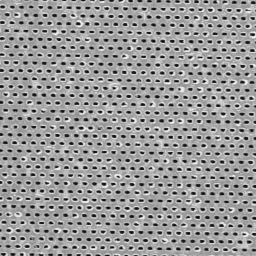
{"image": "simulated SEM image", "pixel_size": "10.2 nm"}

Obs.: a regular array of holes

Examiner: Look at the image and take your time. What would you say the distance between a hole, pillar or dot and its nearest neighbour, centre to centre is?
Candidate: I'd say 91.4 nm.